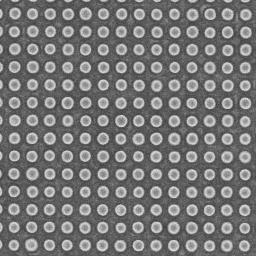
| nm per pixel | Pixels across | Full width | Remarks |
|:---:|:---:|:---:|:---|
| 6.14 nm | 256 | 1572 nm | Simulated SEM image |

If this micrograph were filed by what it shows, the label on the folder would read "a regular array of raised bodies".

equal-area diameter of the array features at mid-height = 67.9 nanometers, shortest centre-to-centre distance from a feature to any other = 106 nanometers